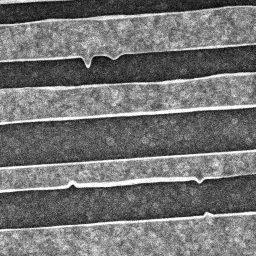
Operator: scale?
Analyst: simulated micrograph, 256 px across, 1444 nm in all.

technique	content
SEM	one or a few lines or trenches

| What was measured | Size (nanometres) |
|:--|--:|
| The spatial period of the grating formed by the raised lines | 384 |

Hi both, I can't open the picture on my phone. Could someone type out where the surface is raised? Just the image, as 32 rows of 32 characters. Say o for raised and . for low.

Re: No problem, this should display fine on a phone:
................................
........................oooooooo
........oooooooooooooooooooooooo
oooooooooooooooooooooooooooooooo
oooooooooooooooooooooooooooooooo
oooooooooooooooooooooooooooooooo
ooooooooooooooooooo.............
ooo.......o.....................
................................
...........................ooooo
...............ooooooooooooooooo
oooooooooooooooooooooooooooooooo
oooooooooooooooooooooooooooooooo
oooooooooooooooooooooooooooo....
ooooooooooooo...................
................................
................................
................................
................................
.......................ooooooooo
.........ooooooooooooooooooooooo
oooooooooooooooooooooooooooooooo
oooooooooooooooooo......o.......
oooooo..........................
................................
................................
................................
.....................ooooooooooo
......oooooooooooooooooooooooooo
oooooooooooooooooooooooooooooooo
oooooooooooooooooooooooooooooooo
oooooooooooooooooooooooooooooooo